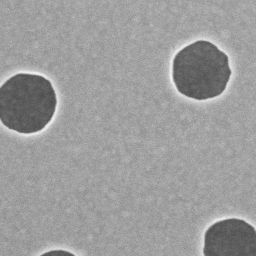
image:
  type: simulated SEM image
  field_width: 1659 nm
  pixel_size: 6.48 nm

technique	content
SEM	holes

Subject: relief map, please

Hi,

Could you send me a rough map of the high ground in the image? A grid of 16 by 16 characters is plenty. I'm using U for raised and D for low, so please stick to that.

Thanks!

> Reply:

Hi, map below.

UUUUUUUUUUUUUUUU
UUUUUUUUUUUUUUUU
UUUUUUUUUUUUUUUU
UUUUUUUUUUUDDDUU
UUUUUUUUUUUDDDUU
DDDUUUUUUUUDDDUU
DDDDUUUUUUUUUUUU
DDDUUUUUUUUUUUUU
UUUUUUUUUUUUUUUU
UUUUUUUUUUUUUUUU
UUUUUUUUUUUUUUUU
UUUUUUUUUUUUUUUU
UUUUUUUUUUUUUUUU
UUUUUUUUUUUUUUUU
UUUUUUUUUUUUUDDD
UUUUUUUUUUUUUDDD